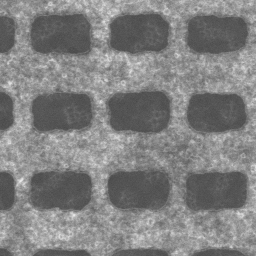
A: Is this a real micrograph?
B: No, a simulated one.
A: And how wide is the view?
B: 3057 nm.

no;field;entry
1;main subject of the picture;a regular array of raised bodies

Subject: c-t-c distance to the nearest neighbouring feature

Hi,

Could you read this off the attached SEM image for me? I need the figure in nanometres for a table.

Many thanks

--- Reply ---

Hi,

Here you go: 925